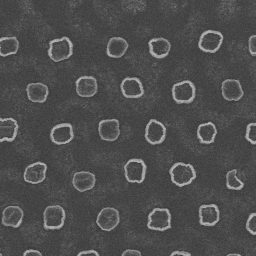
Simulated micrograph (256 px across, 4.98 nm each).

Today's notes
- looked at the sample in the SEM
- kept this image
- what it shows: a regular array of raised bodies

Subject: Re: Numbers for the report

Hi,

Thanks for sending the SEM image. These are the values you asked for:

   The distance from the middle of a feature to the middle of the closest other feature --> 225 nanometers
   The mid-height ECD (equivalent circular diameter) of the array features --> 21.2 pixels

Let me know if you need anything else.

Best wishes